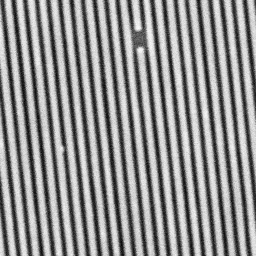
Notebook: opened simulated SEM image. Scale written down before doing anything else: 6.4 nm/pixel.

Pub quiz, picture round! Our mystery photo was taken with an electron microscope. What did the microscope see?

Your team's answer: parallel lines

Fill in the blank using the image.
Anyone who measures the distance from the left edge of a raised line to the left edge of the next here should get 73.5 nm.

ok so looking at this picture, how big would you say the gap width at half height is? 0.0349 microns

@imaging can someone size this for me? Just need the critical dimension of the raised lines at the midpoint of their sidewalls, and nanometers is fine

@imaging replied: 34.9